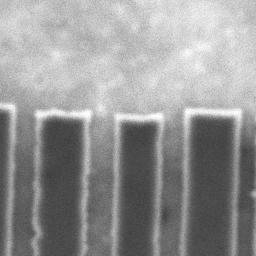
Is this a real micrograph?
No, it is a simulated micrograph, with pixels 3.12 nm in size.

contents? one or a few lines or trenches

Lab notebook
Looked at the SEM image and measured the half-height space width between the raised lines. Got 71.8 nm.